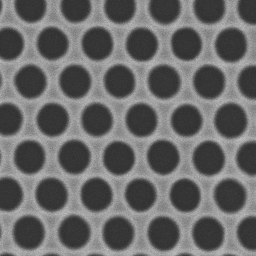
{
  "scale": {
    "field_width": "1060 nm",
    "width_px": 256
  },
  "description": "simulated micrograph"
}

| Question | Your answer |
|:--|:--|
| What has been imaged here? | a regular array of holes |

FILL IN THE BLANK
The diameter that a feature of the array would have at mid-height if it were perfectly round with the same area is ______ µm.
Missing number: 0.136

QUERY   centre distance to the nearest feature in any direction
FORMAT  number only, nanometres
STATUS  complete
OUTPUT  179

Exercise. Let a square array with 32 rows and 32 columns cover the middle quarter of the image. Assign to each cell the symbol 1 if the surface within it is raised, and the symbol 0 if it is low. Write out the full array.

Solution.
10001111111100011111111000111111
00000111111000000111110000001111
00000011110000000111100000001111
00000001110000000011100000000111
00000001110000000011100000000111
00000001110000000011100000000111
00000011110000000111100000000111
00000011111000000111110000001111
11001111111110011111111100111111
11111111111111111111111111111111
11111100001111111000001111111000
11111000000111110000000111110000
01110000000011110000000111100000
01110000000011100000000111100000
01110000000011100000000111100000
01111000000011110000000111100000
11111000000011110000000111110000
11111100001111111000001111111000
11111111111111111111111111111111
10000111111100111111111000011111
00000011111000001111110000001111
00000011110000000111100000000111
00000001110000000011100000000111
00000001110000000011100000000111
00000001110000000011100000000111
00000011110000000111100000001111
00000111111000000111110000011111
11001111111100011111111100111111
11111111011111111111111111111111
11111100000111111000001111110000
11111000000111110000001111100000
01110000000011100000000111100000